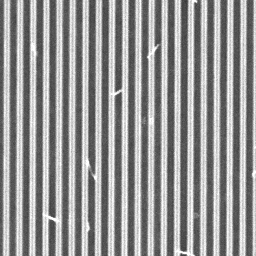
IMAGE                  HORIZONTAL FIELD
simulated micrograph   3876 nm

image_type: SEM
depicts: parallel lines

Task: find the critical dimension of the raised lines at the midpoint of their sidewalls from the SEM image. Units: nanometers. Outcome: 87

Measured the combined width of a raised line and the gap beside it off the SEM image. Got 0.199 micrometres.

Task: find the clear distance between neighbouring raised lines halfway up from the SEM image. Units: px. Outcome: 7.62